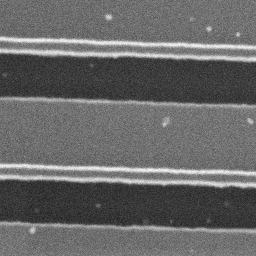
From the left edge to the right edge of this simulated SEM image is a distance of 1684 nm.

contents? lines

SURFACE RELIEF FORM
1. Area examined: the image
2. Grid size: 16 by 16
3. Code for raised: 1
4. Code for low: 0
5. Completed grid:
1111111111111111
1111111111111111
1111111111111111
0000000111111111
0000000000000000
0000000000000000
1111111111110000
1111111111111111
1111111111111111
1111111111111111
1111111111111111
0000000000100111
0000000000000000
0000000000000000
1111111111111111
1111111111111111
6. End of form